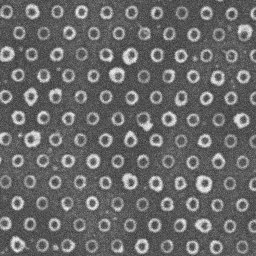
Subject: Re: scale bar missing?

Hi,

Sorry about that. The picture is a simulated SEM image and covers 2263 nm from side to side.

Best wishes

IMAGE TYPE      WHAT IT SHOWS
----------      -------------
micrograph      a regular array of raised bodies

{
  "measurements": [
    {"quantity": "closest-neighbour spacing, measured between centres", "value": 214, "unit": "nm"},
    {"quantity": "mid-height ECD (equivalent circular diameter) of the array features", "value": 105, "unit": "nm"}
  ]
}